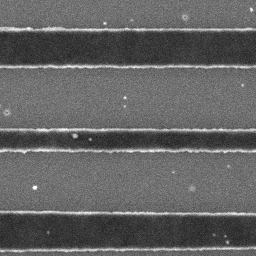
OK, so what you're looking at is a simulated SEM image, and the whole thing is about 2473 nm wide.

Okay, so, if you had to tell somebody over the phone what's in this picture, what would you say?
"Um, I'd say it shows lines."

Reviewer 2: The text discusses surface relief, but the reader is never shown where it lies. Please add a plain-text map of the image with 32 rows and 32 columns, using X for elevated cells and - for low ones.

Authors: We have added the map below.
--------------------------------
--------------------------------
--------------------------------
--------------------------------
XXXXXXXXXXXXXXXXXXXXXXXXXXXXXXXX
XXXXXXXXXXXXXXXXXXXXXXXXXXXXXXXX
XXXXXXXXXXXXXXXXXXXXXXXXXXXXXXXX
XXXXXXXXXXXXXXXXXXXXXXXXXXXXXXXX
--------------------------------
--------------------------------
--------------------------------
--------------------------------
--------------------------------
--------------------------------
--------------------------------
--------------------------------
XXXXXXXXXXXXXXXXXXXXXXXXXXXXXXXX
XXXXXXXXXXXXXXXXXXXXXXXXXXXXXXXX
XXXXXXXXXXXXXXXXXXXXXXXXXXXXXXXX
--------------------------------
--------------------------------
--------------------------------
--------------------------------
--------------------------------
--------------------------------
--------------------------------
XXXXXXXX------------------------
XXXXXXXXXXXXXXXXXXXXXXXXXXXXXXXX
XXXXXXXXXXXXXXXXXXXXXXXXXXXXXXXX
XXXXXXXXXXXXXXXXXXXXXXXXXXXXXXXX
XXXXXXXXXXXXXXXXXXXXXXXXXXXXXXXX
--------------------------------